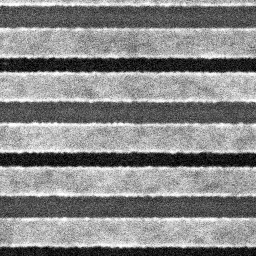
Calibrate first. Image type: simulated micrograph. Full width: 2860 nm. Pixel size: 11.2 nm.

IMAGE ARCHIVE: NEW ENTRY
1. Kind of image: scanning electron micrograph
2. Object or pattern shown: lines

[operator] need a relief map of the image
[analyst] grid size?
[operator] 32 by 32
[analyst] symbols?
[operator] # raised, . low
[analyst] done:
################################
................................
................................
................................
################################
################################
################################
................................
................................
################################
################################
################################
################################
................................
................................
................................
################################
################################
################################
................................
................................
################################
################################
################################
................................
................................
................................
################################
################################
################################
################################
................................